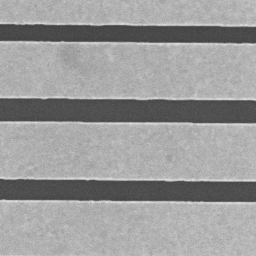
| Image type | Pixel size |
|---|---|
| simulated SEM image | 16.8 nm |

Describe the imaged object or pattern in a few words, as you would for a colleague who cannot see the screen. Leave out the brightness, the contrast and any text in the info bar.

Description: lines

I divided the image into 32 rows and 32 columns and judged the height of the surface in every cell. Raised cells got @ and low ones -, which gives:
@@@@@@@@@@@@@@@@@@@@@@@@@@@@@@@@
@@@@@@@@@@@@@@@@@@@@@@@@@@@@@@@@
@@@@@@@@@@@@@@@@@@@@@@@@@@@@@@@@
--------------------------------
--------------------------------
@@@@@@@@@@@@@@@@@@@@@@@@@@@@@---
@@@@@@@@@@@@@@@@@@@@@@@@@@@@@@@@
@@@@@@@@@@@@@@@@@@@@@@@@@@@@@@@@
@@@@@@@@@@@@@@@@@@@@@@@@@@@@@@@@
@@@@@@@@@@@@@@@@@@@@@@@@@@@@@@@@
@@@@@@@@@@@@@@@@@@@@@@@@@@@@@@@@
@@@@@@@@@@@@@@@@@@@@@@@@@@@@@@@@
-------------------------------@
--------------------------------
--------------------------------
@@@@@@@@@@@@@@@@@@@@@@@@@@@@@@@@
@@@@@@@@@@@@@@@@@@@@@@@@@@@@@@@@
@@@@@@@@@@@@@@@@@@@@@@@@@@@@@@@@
@@@@@@@@@@@@@@@@@@@@@@@@@@@@@@@@
@@@@@@@@@@@@@@@@@@@@@@@@@@@@@@@@
@@@@@@@@@@@@@@@@@@@@@@@@@@@@@@@@
@@@@@@@@@@@@@@@@@@@@@@@@@@@@@@@@
--------------------@@-@@@@@@@@@
--------------------------------
--------------------------------
@@@@@@@@@@@@@@@@@@@@@@@@@@@@@@@@
@@@@@@@@@@@@@@@@@@@@@@@@@@@@@@@@
@@@@@@@@@@@@@@@@@@@@@@@@@@@@@@@@
@@@@@@@@@@@@@@@@@@@@@@@@@@@@@@@@
@@@@@@@@@@@@@@@@@@@@@@@@@@@@@@@@
@@@@@@@@@@@@@@@@@@@@@@@@@@@@@@@@
@@@@@@@@@@@@@@@@@@@@@@@@@@@@@@@@